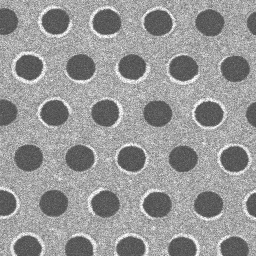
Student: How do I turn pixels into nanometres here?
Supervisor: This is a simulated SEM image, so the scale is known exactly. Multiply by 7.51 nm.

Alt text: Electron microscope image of a regular array of holes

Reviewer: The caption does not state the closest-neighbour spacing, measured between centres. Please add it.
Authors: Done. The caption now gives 385 nm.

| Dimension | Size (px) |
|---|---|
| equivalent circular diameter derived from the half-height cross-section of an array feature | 27.4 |